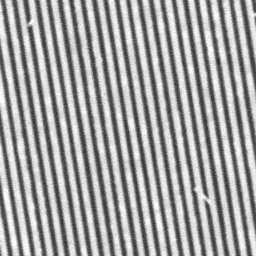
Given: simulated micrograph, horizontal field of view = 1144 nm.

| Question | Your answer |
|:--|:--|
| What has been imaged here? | parallel lines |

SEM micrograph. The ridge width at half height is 0.0231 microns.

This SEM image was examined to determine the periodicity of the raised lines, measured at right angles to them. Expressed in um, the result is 0.0504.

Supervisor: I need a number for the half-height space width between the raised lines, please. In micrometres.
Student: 0.027